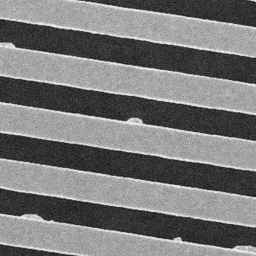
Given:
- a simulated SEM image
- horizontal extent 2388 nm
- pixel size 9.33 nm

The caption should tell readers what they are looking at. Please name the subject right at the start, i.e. lines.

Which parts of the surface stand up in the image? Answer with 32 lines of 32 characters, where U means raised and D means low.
UUUUUUUUUUUUDDDDDDDDDDDDDDDDDDDD
UUUUUUUUUUUUUUUUUUUDDDDDDDDDDDDD
DUUUUUUUUUUUUUUUUUUUUUUUUUDDDDDD
DDDDDDDDUUUUUUUUUUUUUUUUUUUUUUUU
DDDDDDDDDDDDDDUUUUUUUUUUUUUUUUUU
DDDDDDDDDDDDDDDDDDDDDUUUUUUUUUUU
UUUUUUDDDDDDDDDDDDDDDDDDDDDDUUUU
UUUUUUUUUUUUDDDDDDDDDDDDDDDDDDDD
UUUUUUUUUUUUUUUUUUDDDDDDDDDDDDDD
UUUUUUUUUUUUUUUUUUUUUUUUUDDDDDDD
DDDDDDDUUUUUUUUUUUUUUUUUUUUUUUUD
DDDDDDDDDDDDDUUUUUUUUUUUUUUUUUUU
DDDDDDDDDDDDDDDDDDDDUUUUUUUUUUUU
UUUUDDDDDDDDDDDDDDDDDDDDDDUUUUUU
UUUUUUUUUUUDDDDDDDDDDDDDDDDDDDDD
UUUUUUUUUUUUUUUUUUDDDDDDDDDDDDDD
UUUUUUUUUUUUUUUUUUUUUUUUDDDDDDDD
DDDDDDUUUUUUUUUUUUUUUUUUUUUUUUUD
DDDDDDDDDDDDDUUUUUUUUUUUUUUUUUUU
DDDDDDDDDDDDDDDDDDDDUUUUUUUUUUUU
UUUUUDDDDDDDDDDDDDDDDDDDDDUUUUUU
UUUUUUUUUUUDDDDDDDDDDDDDDDDDDDDD
UUUUUUUUUUUUUUUUUUDDDDDDDDDDDDDD
UUUUUUUUUUUUUUUUUUUUUUUUDDDDDDDD
DDDDDDDUUUUUUUUUUUUUUUUUUUUUUUDD
DDDDDDDDDDDDDUUUUUUUUUUUUUUUUUUU
DDDDDDDDDDDDDDDDDDDUUUUUUUUUUUUU
UUUUUDDDDDDDDDDDDDDDDDDDDDUUUUUU
UUUUUUUUUUUUDDDDDDDDDDDDDDDDDDDD
UUUUUUUUUUUUUUUUUUDDDDDDDDDDDDDD
UUUUUUUUUUUUUUUUUUUUUUUUUDDDDDDD
DDDDDDDUUUUUUUUUUUUUUUUUUUUUUUUD